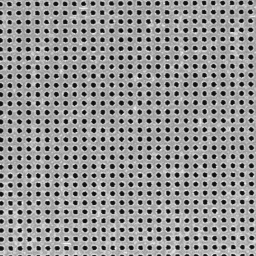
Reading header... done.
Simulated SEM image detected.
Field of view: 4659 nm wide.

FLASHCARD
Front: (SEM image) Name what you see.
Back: a regular array of holes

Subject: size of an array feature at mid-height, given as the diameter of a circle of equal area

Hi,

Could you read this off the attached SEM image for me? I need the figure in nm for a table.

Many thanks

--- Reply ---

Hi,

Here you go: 91.9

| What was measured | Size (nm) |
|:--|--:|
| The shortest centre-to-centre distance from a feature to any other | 164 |